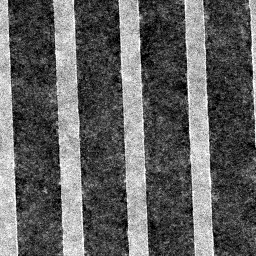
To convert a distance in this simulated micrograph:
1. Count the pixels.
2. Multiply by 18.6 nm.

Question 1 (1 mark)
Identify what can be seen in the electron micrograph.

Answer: one or a few lines or trenches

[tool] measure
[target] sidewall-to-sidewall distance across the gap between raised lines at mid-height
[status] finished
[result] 851 nm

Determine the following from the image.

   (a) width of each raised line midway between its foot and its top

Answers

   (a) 356 nm